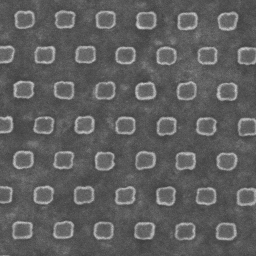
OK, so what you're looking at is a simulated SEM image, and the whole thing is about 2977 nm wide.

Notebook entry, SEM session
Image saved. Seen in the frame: a regular array of raised bodies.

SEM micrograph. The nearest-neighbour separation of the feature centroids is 466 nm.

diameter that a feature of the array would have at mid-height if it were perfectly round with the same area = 221 nm